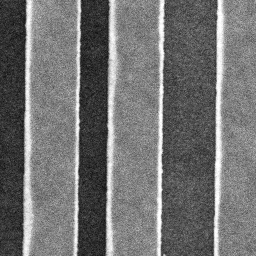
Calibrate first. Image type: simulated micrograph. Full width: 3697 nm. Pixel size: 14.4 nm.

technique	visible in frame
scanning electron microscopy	lines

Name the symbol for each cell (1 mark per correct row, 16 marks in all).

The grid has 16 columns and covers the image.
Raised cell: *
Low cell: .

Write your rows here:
..***..***....**
..***..***....**
..***..***....**
..***..***....**
..***..***....**
..***..***....**
..***..***....**
..***..***....**
..***..***....**
..***..***....**
..***..***....**
..***..***...***
..***..***...***
..***..***...***
..***..***...***
..***..***...***